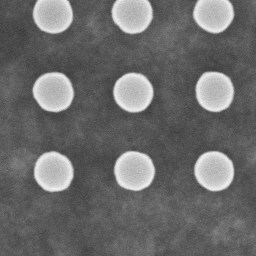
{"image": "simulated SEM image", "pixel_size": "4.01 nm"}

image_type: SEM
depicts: raised bodies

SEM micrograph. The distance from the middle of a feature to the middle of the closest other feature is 318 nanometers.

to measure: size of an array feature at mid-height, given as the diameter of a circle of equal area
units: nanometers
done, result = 153